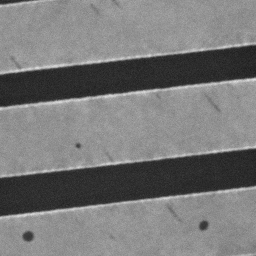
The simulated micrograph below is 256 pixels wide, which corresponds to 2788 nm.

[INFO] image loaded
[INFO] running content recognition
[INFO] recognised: lines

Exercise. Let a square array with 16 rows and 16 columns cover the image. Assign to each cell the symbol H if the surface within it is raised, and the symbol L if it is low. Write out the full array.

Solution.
HHHHHHHHHHHHHHHH
HHHHHHHHHHHHHHHH
HHHHHHHHHHHHHHHH
HHHHHHHHHHLLLLLL
HLLLLLLLLLLLLLLL
LLLLLLLLLLLHHHHH
LLHHHHHHHHHHHHHH
HHHHHHHHHHHHHHHH
HHHHHHHHHHHHHHHH
HHHHHHHHHHHHHHLL
HHHHHHLLLLLLLLLL
LLLLLLLLLLLLLLLL
LLLLLLLLLHHHHHHH
HHHHHHHHHHHHHHHH
HHHHHHHHHHHHHHHH
HHHHHHHHHHHHHHHH